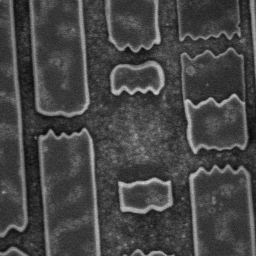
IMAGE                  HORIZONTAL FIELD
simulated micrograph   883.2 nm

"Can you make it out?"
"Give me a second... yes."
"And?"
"one or a few lines or trenches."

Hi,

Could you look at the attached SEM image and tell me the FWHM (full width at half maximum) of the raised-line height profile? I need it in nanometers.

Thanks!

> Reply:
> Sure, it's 177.